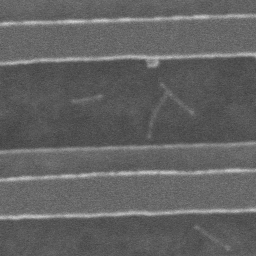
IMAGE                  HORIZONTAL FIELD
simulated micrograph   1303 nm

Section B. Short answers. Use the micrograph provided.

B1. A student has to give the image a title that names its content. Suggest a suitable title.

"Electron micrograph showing lines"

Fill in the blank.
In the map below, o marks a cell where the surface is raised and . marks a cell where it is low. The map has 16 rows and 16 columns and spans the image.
oooooooooooooooo
oooooooooooooooo
oooooooooooooooo
ooooooooooooooo.
................
................
................
................
................
oooooooooooooooo
oooooooooooooooo
oooooooooooooooo
oooooooooooooooo
oooooo..........
................
................